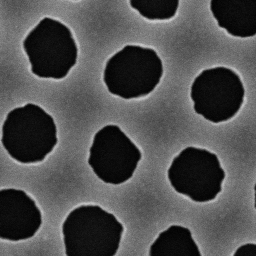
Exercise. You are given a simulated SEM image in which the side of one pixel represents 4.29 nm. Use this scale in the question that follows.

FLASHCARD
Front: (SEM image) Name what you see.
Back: holes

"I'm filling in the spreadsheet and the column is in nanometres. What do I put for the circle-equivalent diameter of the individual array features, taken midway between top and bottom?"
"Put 237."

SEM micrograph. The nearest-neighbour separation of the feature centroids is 366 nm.